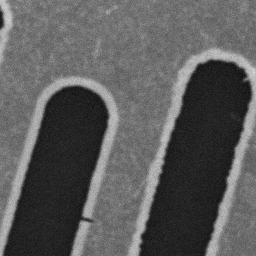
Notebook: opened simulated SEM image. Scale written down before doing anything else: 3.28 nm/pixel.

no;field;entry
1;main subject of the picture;one or a few lines or trenches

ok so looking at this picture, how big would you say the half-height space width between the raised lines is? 0.24 micrometres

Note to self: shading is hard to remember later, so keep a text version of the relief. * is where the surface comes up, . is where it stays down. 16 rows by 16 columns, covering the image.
****************
****************
****************
*************.**
************....
***...*****.....
***....****.....
**.....****.....
**.....***.....*
**.....***.....*
*.....****.....*
*.....****....**
*.....***.....**
*....****.....**
.....****.....**
.....***.....***